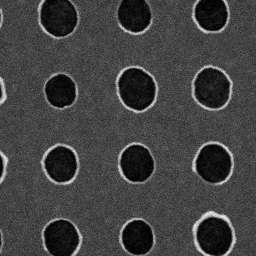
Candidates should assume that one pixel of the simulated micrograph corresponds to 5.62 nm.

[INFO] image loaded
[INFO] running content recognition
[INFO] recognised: holes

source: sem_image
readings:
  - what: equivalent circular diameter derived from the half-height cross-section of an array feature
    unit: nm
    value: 200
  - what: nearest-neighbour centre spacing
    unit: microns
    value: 0.417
